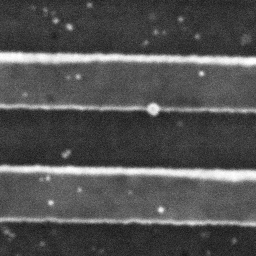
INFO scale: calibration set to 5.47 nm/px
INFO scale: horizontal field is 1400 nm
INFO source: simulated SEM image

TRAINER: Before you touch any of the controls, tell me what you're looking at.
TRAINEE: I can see lines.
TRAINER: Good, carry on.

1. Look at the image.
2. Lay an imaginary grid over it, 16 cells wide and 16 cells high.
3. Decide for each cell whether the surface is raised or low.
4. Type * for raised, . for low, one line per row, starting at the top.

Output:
................
................
................
********........
****************
****************
****************
................
................
................
***.............
****************
****************
****************
................
................